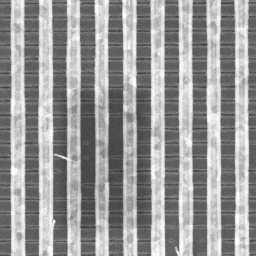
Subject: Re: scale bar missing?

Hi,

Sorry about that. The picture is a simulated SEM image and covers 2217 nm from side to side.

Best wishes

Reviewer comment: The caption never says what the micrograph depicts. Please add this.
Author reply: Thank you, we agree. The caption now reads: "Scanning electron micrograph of wiring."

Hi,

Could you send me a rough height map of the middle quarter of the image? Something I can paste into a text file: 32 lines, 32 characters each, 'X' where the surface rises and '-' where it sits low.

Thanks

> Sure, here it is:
-XXX----XXX----XXX----XXX----XXX
-XXX----XXX----XXX----XXX----XXX
-XXX----XXX----XXX----XXX----XXX
-XXX----XXX----XXX----XXX----XXX
-XXX----XXX----XXX----XXX----XXX
-XXX----XXX----XXX----XXX----XXX
-XXX----XXX----XXX----XXX----XXX
-XXX----XXX----XXX----XXX----XXX
-XXX----XXX----XXX----XXX----XXX
-XXX----XXX----XXX----XXX----XXX
-XXX----XXX----XXX----XXX----XXX
-XXX----XXX----XXX----XXX----XXX
-XXX----XXX----XXX----XXX----XXX
-XXX----XXX----XXX----XXX----XXX
-XXX----XXX----XXX----XXX----XXX
-XXX----XXX----XXX----XXX----XXX
-XXX----XXX----XXX----XXX----XXX
-XXX----XXX----XXX----XXX----XXX
-XXX----XXX----XXX----XXX----XXX
-XXX----XXX----XXX----XXX----XXX
-XXX----XXX----XXX----XXX----XXX
-XXX----XXX----XXX----XXX----XXX
-XXX----XXX----XXX----XXX----XXX
-XXX----XXX----XXX----XXX----XXX
-XXX----XXX----XXX----XXX----XXX
-XXX----XXX----XXX----XXX----XXX
-XXX----XXX----XXX----XXX----XXX
-XXX----XXX----XXX----XXX----XXX
-XXX----XXX----XXX----XXX----XXX
-XXX----XXX----XXX----XXX----XXX
-XXX----XXX----XXX----XXX----XXX
-XXX----XXX----XXX----XXX----XXX